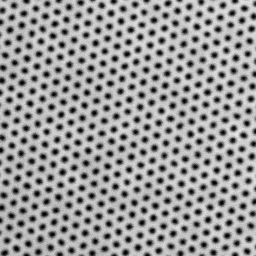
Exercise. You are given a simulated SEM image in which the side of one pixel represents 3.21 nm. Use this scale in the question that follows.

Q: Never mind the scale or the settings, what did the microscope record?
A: a regular array of holes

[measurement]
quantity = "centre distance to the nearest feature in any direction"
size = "38.8 nanometers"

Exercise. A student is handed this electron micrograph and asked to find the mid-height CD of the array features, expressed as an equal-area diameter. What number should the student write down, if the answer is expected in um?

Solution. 0.0227